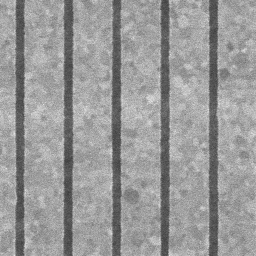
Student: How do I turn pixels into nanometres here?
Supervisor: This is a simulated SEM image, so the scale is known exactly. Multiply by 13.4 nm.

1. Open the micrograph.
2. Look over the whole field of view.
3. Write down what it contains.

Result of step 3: parallel lines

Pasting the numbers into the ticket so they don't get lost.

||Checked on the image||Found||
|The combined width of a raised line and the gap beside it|648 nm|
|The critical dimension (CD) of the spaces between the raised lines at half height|124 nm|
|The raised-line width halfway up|524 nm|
